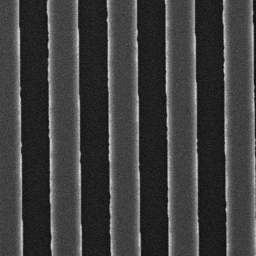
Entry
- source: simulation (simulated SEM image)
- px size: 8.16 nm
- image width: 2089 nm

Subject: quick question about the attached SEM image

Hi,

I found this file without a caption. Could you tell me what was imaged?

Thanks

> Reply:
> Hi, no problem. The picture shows lines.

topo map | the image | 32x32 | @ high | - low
@@----@@@@---@@@@----@@@----@@@@
@@----@@@@----@@@----@@@----@@@@
@@----@@@@---@@@@----@@@----@@@@
@@----@@@@----@@@----@@@----@@@@
@@----@@@@----@@@----@@@----@@@@
@@----@@@@----@@@----@@@----@@@@
@@----@@@@----@@@----@@@----@@@@
@@----@@@@----@@@----@@@----@@@@
@@----@@@@----@@@----@@@----@@@@
@@----@@@@----@@@----@@@----@@@@
@@----@@@@----@@@----@@@@---@@@@
@@----@@@@----@@@----@@@@---@@@@
@@@---@@@@----@@@----@@@@---@@@@
@@@---@@@@----@@@----@@@@---@@@@
@@@---@@@@----@@@----@@@@---@@@@
@@@---@@@@----@@@----@@@@---@@@@
@@@---@@@@----@@@----@@@@---@@@@
@@@---@@@@----@@@----@@@@---@@@@
@@@---@@@@----@@@----@@@@---@@@@
@@@---@@@@----@@@----@@@@---@@@@
@@@---@@@@----@@@----@@@@---@@@@
@@@---@@@@----@@@----@@@@---@@@@
@@@---@@@@----@@@----@@@@---@@@@
@@@---@@@@----@@@----@@@@---@@@@
@@@---@@@@----@@@----@@@@---@@@@
@@@---@@@@----@@@----@@@@---@@@@
@@@---@@@@----@@@----@@@@---@@@@
@@@---@@@@----@@@----@@@@---@@@@
@@@---@@@@----@@@----@@@@---@@@@
@@@---@@@@----@@@@---@@@@---@@@@
@@@---@@@@----@@@@---@@@@---@@@@
@@@---@@@@----@@@@---@@@@---@@@@